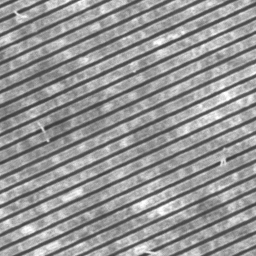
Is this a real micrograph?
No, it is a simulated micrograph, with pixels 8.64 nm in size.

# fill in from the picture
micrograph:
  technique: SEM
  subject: parallel lines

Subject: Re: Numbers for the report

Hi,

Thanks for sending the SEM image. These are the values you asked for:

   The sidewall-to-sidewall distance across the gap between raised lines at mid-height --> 32.4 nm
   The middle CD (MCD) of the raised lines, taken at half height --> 9.1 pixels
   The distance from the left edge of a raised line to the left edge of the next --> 112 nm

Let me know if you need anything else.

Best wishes